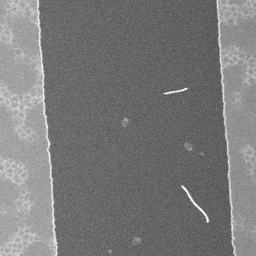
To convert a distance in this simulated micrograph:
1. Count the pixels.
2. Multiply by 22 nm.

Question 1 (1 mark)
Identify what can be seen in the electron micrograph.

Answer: one or a few lines or trenches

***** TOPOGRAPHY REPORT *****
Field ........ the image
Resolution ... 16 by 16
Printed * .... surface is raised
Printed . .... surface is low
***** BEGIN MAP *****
..************..
..************..
..************..
...***********..
...***********..
...***********..
...***********..
...***********..
...***********..
...***********..
...***********..
...***********..
...***********..
...***********..
...************.
...************.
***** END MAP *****